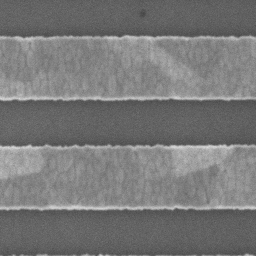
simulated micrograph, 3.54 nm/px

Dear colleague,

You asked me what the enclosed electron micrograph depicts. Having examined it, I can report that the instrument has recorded lines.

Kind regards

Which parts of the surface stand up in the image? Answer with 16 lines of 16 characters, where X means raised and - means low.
----------------
----------------
XXXXXXXXXXXXXXXX
XXXXXXXXXXXXXXXX
XXXXXXXXXXXXXXXX
XXXXXXXXXXXXXXXX
----------------
----------------
----------------
XXXXXXXXXXXXXXXX
XXXXXXXXXXXXXXXX
XXXXXXXXXXXXXXXX
XXXXXXXXXXXXXXXX
----------------
----------------
----------------